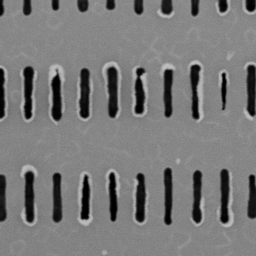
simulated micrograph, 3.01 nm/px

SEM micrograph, a regular array of holes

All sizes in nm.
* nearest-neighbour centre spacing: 83.3